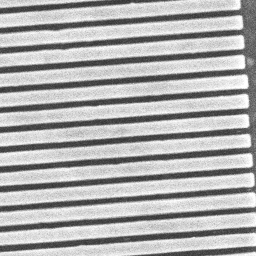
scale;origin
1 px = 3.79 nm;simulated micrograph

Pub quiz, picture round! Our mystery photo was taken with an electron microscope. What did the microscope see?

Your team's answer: parallel lines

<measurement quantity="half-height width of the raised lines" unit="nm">50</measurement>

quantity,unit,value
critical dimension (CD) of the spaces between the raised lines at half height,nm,23.6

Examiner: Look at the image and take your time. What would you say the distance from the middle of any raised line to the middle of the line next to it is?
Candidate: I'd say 0.0748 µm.